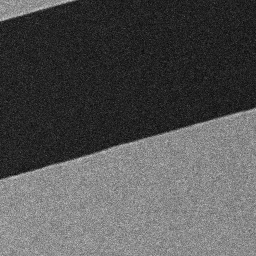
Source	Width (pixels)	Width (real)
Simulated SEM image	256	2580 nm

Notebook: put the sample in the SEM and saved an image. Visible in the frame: one or a few lines or trenches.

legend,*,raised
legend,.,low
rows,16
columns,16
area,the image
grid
***.............
................
................
................
................
................
................
.............***
..........******
......**********
...*************
****************
****************
****************
****************
****************